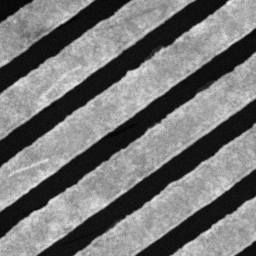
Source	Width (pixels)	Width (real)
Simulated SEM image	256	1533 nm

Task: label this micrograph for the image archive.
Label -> lines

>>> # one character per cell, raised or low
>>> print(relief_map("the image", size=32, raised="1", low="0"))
00011111111000001111111100001111
00111111110000011111110000011111
01111111100001111111100000111111
11111110000011111110000011111111
11111100001111111100000111111110
11110000011111111000011111111000
11100000111111100000111111110000
11000011111111000001111111000001
00000111111110000111111110000111
00011111111000001111111100001111
00111111110000111111110000011111
11111111000001111111100001111111
11111110000111111110000011111111
11111100001111111100001111111100
11110000011111111000011111111000
11100001111111100000111111100000
10000011111111000011111111000001
00000111111100000111111110000111
00011111111000001111111000001111
00111111110000111111110000011111
11111111000001111111100001111111
11111110000111111110000011111110
11111000001111111100001111111100
11110000011111110000011111111000
11100001111111100000111111100000
10000011111111000011111111000011
00001111111100000111111100000111
00011111111000011111111000001111
00111111100000111111110000111111
11111111000011111111000001111111
11111110000111111110000111111110
11111000001111111000001111111100